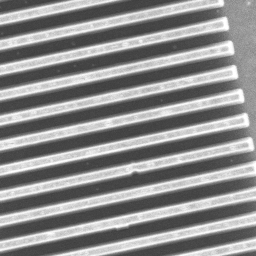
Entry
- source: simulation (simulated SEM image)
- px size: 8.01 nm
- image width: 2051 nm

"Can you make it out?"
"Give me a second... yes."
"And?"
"parallel lines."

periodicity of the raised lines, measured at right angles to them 24.6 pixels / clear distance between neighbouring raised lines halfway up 108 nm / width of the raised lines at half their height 0.0931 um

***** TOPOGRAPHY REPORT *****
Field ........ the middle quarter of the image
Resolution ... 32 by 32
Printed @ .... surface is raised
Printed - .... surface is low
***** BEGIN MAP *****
-------------@@@@@@@@@@@@@------
--------@@@@@@@@@@@@@-----------
----@@@@@@@@@@@@----------------
@@@@@@@@@@@@-----------------@@@
@@@@@@@-----------------@@@@@@@@
@@-----------------@@@@@@@@@@@@@
--------------@@@@@@@@@@@@@@----
---------@@@@@@@@@@@@@@---------
----@@@@@@@@@@@@@@--------------
@@@@@@@@@@@@@@----------------@@
@@@@@@@@@----------------@@@@@@@
@@@@----------------@@@@@@@@@@@@
---------------@@@@@@@@@@@@@@---
----------@@@@@@@@@@@@@@--------
-----@@@@@@@@@@@@@@-------------
-@@@@@@@@@@@@@@-----------------
@@@@@@@@@@-----------------@@@@@
@@@@@-----------------@@@@@@@@@@
-----------------@@@@@@@@@@@@@--
------------@@@@@@@@@@@@@-------
-------@@@@@@@@@@@@@@-----------
---@@@@@@@@@@@@@@---------------
@@@@@@@@@@@@----------------@@@@
@@@@@@@----------------@@@@@@@@@
@@----------------@@@@@@@@@@@@@@
-------------@@@@@@@@@@@@@@-----
--------@@@@@@@@@@@@@@----------
----@@@@@@@@@@@@@---------------
@@@@@@@@@@@@@-----------------@@
@@@@@@@@-----------------@@@@@@@
@@@-----------------@@@@@@@@@@@@
---------------@@@@@@@@@@@@@----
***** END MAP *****